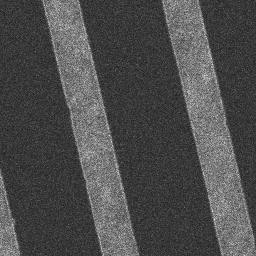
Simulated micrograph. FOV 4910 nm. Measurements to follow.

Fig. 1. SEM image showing one or a few lines or trenches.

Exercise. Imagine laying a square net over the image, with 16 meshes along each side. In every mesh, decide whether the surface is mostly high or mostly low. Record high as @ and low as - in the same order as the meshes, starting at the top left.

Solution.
@@@--@@@@@--@@@@
@@@--@@@@@@--@@@
@@@--@@@@@@--@@@
@@@@--@@@@@--@@@
@@@@--@@@@@--@@@
@@@@--@@@@@---@@
@@@@--@@@@@@--@@
@@@@---@@@@@--@@
@@@@@--@@@@@--@@
@@@@@--@@@@@---@
@@@@@--@@@@@@--@
@@@@@---@@@@@--@
@@@@@@--@@@@@--@
-@@@@@--@@@@@--@
-@@@@@--@@@@@@--
-@@@@@--@@@@@@--